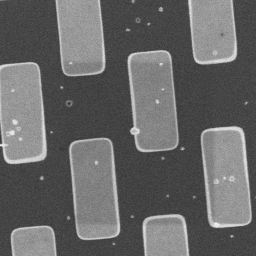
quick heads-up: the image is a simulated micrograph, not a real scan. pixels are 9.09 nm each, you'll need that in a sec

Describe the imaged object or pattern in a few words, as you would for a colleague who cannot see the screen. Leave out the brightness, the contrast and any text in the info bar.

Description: groups of lines, slits or small figures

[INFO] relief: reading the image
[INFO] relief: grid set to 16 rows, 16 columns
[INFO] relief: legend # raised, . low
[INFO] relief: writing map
....##......###.
....##......###.
....##......###.
....###.###.##..
##..##..###.....
###.....###.....
###.....###.....
###.....###.....
###.....###..##.
###.###......##.
....###......##.
.....##......###
.....##......###
.....##......###
.##..##..###....
.##......###....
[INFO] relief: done